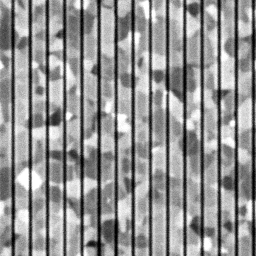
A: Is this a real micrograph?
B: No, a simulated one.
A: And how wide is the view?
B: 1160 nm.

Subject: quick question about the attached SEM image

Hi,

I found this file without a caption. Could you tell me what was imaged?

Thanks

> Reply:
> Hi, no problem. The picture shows parallel lines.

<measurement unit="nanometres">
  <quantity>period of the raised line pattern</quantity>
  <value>77.8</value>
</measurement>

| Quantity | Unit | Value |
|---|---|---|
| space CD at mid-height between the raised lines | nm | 20.4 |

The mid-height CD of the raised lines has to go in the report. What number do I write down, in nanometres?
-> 56.6